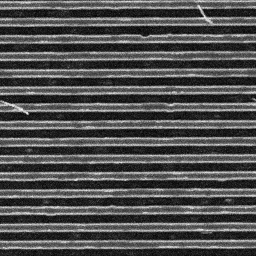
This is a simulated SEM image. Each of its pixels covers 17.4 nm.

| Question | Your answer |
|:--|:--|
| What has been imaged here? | parallel lines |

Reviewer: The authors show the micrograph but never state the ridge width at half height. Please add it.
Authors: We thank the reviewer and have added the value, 126 nm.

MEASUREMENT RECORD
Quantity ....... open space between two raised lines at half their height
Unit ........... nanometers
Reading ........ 174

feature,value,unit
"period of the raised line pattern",299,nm